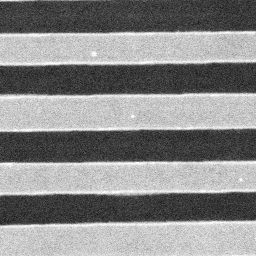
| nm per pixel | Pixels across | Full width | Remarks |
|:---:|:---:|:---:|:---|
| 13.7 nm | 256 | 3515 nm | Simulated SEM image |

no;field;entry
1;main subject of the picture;lines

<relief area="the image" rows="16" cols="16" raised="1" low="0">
0000000000000000
0000000000000000
1111111111111111
1111111111111111
0000000000000000
0000000000000000
1111111111111111
1111111111111111
0000000000000000
0000000000000000
1111111111111111
1111111111111111
0000000000000000
0000000000000000
1111111111111111
1111111111111111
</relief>